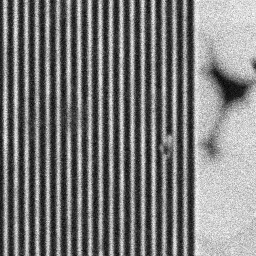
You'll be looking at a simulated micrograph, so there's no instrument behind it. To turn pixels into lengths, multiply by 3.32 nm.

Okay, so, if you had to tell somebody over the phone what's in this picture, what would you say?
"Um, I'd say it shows parallel lines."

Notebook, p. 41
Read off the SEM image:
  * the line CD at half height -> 1.75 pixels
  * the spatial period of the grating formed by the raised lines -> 35.1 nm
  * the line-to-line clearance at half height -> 29.1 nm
